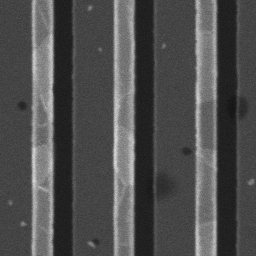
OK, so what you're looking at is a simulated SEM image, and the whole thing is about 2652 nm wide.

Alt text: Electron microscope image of lines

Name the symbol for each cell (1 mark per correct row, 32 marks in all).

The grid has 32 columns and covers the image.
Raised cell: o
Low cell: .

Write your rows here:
ooooooo..oooooooo..oooooooo...oo
ooooooo..oooooooo..oooooooo...oo
ooooooo..oooooooo..oooooooo...oo
ooooooo..oooooooo..oooooooo...oo
ooooooo..oooooooo..oooooooo...oo
ooooooo..oooooooo..oooooooo...oo
ooooooo..oooooooo..oooooooo...oo
ooooooo..oooooooo..oooooooo...oo
ooooooo..oooooooo..oooooooo...oo
ooooooo..oooooooo..oooooooo...oo
ooooooo..oooooooo..oooooooo...oo
ooooooo..oooooooo..oooooooo...oo
ooooooo..oooooooo..oooooooo...oo
ooooooo..oooooooo..oooooooo...oo
ooooooo..oooooooo..oooooooo...oo
ooooooo..oooooooo..oooooooo...oo
ooooooo..oooooooo..oooooooo...oo
ooooooo..oooooooo..oooooooo...oo
ooooooo..oooooooo..oooooooo...oo
ooooooo..oooooooo..oooooooo...oo
ooooooo..oooooooo..oooooooo...oo
ooooooo..oooooooo..oooooooo...oo
ooooooo..oooooooo..oooooooo...oo
ooooooo..oooooooo..oooooooo...oo
ooooooo..oooooooo..oooooooo...oo
ooooooo..oooooooo..oooooooo...oo
ooooooo..oooooooo..oooooooo...oo
ooooooo..oooooooo..oooooooo...oo
ooooooo..oooooooo..oooooooo...oo
ooooooo..oooooooo..oooooooo...oo
ooooooo..oooooooo..oooooooo...oo
ooooooo..oooooooo..oooooooo...oo